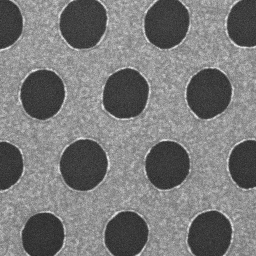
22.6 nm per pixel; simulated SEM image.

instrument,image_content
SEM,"holes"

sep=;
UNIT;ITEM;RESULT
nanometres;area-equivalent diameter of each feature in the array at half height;1090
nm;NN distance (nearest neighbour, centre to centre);1860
